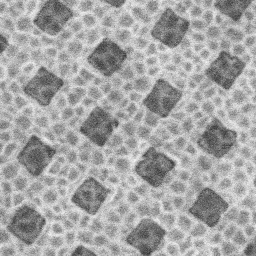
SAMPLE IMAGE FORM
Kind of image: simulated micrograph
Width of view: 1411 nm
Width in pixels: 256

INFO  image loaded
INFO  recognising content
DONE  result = a regular array of holes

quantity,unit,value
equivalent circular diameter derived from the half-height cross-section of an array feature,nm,197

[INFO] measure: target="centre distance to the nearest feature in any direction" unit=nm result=376